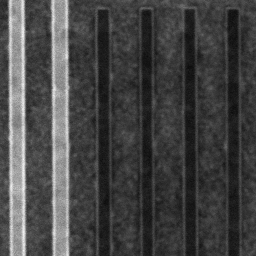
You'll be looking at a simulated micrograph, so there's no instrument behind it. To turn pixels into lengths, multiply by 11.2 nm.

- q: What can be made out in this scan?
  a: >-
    parallel lines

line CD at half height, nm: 143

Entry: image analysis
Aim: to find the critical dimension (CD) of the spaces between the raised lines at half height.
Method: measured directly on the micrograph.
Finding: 342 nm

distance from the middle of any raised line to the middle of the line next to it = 485 nm